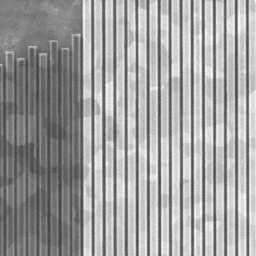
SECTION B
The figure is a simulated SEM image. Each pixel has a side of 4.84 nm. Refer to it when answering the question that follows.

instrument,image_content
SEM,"parallel lines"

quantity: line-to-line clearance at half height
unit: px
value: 3.74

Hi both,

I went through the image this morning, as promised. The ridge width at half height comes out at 32.1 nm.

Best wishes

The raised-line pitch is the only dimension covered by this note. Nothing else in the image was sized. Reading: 53.5 nm